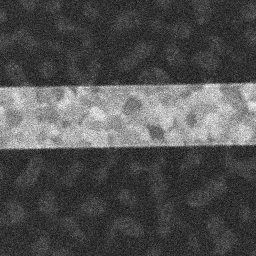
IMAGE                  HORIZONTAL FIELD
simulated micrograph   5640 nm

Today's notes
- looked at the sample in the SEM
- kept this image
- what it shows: one or a few lines or trenches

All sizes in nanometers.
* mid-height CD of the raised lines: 1310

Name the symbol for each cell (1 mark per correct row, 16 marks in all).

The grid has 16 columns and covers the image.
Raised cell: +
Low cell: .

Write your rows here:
................
................
................
................
................
....++++++++++++
++++++++++++++++
++++++++++++++++
++++++++++++++++
................
................
................
................
................
................
................